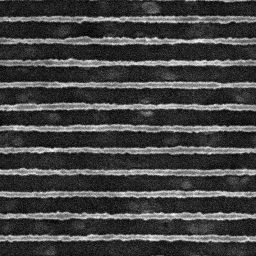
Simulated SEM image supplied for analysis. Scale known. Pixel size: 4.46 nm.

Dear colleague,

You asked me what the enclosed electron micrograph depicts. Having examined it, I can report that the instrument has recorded parallel lines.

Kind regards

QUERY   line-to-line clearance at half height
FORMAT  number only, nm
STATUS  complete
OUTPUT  77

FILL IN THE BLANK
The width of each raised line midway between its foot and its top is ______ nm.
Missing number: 21.2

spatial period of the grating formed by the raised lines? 97.4 nm